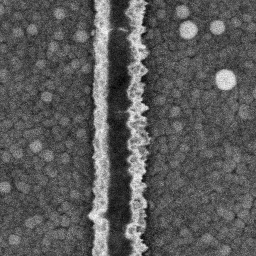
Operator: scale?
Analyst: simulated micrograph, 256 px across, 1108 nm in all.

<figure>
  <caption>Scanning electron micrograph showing one or a few lines or trenches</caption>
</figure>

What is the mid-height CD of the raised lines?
162 nanometres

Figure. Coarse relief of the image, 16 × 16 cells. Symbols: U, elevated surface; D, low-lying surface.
DDDDDDUUUDDDDDDD
DDDDDDUUUDDDDDDD
DDDDDDUUUDDDDDDD
DDDDDDUUUDDDDDDD
DDDDDDUUUDDDDDDD
DDDDDDUUUDDDDDDD
DDDDDDUUUDDDDDDD
DDDDDDUUUDDDDDDD
DDDDDDUUUDDDDDDD
DDDDDDUUUDDDDDDD
DDDDDDUUUDDDDDDD
DDDDDDUUDDDDDDDD
DDDDDDUUUDDDDDDD
DDDDDDUUUDDDDDDD
DDDDDDUUDDDDDDDD
DDDDDDUUUDDDDDDD